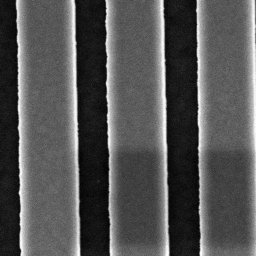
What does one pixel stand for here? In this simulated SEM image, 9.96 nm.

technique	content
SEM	lines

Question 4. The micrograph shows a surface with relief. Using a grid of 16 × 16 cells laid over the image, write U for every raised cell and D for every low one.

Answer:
DUUUUDDUUUDDUUUU
DUUUUDDUUUDDUUUU
DUUUUDDUUUDDUUUU
DUUUUDDUUUDDUUUU
DUUUUDDUUUDDUUUU
DUUUUDDUUUDDUUUU
DUUUUDDUUUDDUUUU
DUUUUDDUUUDDUUUU
DUUUUDDUUUDDUUUU
DUUUUDDUUUDDUUUU
DUUUUDDUUUDDUUUU
DUUUUDDUUUDDUUUU
DUUUUDDUUUDDUUUU
DUUUUDDUUUDDUUUU
DUUUUDDUUUDDDUUU
DUUUUDDUUUUDDUUU